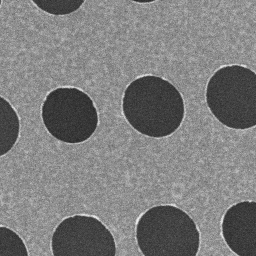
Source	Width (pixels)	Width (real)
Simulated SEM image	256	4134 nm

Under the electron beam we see holes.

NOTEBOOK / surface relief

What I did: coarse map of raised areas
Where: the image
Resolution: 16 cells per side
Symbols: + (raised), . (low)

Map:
+++..+++++++++++
++++++++++++++++
++++++++++++++++
++++++++++++++++
++++++++++++++..
++++++++...++...
.++...++...++...
.++...++...+++..
.++...+++.++++++
++++++++++++++++
++++++++++++++++
++++++++++++++++
++++++++++++++++
+++++++++...++..
.++....++...++..
..+....++...++..